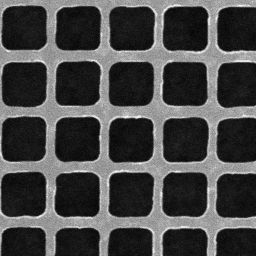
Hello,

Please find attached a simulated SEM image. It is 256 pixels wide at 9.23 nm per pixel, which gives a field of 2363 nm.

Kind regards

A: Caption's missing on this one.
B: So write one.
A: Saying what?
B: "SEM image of a regular array of holes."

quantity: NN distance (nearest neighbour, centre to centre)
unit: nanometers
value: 496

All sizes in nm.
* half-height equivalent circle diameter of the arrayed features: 455